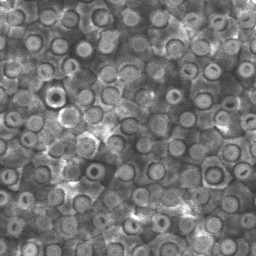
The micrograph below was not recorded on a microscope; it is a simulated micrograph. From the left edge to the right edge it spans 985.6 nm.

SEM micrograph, a regular array of raised bodies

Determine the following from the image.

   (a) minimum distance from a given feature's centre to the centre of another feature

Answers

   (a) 68.6 nm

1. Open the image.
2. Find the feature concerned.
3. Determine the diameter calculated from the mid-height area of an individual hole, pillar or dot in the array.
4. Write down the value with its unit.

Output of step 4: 55.8 nm